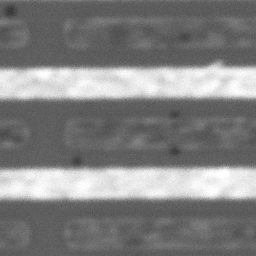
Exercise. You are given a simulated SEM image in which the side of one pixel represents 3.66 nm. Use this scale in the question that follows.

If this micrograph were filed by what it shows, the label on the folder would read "wiring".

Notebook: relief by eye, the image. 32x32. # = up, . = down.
................................
................................
.........#######################
###.....########################
###.....########################
###.....########################
................................
................................
..........................#.....
################################
################################
################################
................................
................................
................................
###.....########################
####....########################
###.....########################
................................
................................
................................
################################
################################
################################
################################
................................
................................
..........##.######.############
####....########################
####....########################
###.....########################
................................